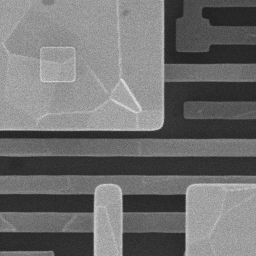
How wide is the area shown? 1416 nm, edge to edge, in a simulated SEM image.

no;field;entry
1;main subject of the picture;wiring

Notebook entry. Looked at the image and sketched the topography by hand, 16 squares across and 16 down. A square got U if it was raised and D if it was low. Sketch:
UUUUUUUUUUDDDDDD
UUUUUUUUUUDDDDDD
UUUUUUUUUUDDDDDD
UUUUUUUUUUDDDDDD
UUUUUUUUUUDDDDDD
UUUUUUUUUUDDDDDD
UUUUUUUUUUDDDDDD
UUUUUUUUUUDDDDDD
DDDDDDDDDDDDDDDD
DDDDDDDDDDDDDDDD
DDDDDDDDDDDDDDDD
DDDDDDDDDDDDDDDD
DDDDDDUUDDDDUUUU
DDDDDDUUDDDDUUUU
DDDDDDUUDDDDUUUU
DDDDDDUUDDDDUUUU